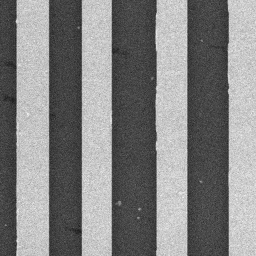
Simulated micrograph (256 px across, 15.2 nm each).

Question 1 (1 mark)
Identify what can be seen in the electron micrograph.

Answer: lines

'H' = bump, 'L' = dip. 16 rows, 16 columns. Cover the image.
LHHLLHHLLLHHLLHH
LHHLLHHLLLHHLLHH
LHHLLHHLLLHHLLHH
LHHLLHHLLLHHLLHH
LHHLLHHLLLHHLLHH
LHHLLHHLLLHHLLHH
LHHLLHHLLLHHLLHH
LHHLLHHLLLHHLLHH
LHHLLHHLLLHHLLHH
LHHLLHHLLLHHLLHH
LHHLLHHLLLHHLLHH
LHHLLHHLLLHHLLHH
LHHLLHHLLLHHLLHH
LHHLLHHLLLHHLLHH
LHHLLHHLLLHHLLHH
LHHLLHHLLLHHLLHH